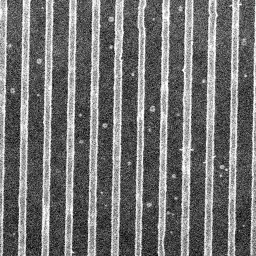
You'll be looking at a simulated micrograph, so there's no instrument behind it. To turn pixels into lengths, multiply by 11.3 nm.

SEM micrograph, parallel lines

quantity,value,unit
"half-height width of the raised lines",69.3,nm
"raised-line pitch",263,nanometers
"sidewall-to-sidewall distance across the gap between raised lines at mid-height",0.194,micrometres